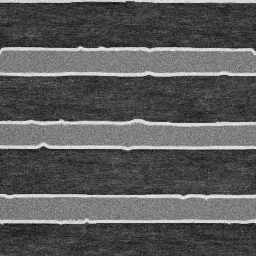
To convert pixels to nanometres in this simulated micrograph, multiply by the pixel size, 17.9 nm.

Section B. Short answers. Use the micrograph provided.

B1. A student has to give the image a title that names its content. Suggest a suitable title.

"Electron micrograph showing one or a few lines or trenches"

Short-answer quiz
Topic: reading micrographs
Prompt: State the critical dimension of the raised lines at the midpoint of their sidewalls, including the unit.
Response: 461 nanometres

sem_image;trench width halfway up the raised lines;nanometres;871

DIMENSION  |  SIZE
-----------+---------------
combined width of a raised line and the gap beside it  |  1320 nm